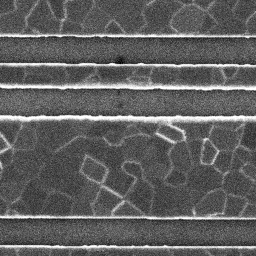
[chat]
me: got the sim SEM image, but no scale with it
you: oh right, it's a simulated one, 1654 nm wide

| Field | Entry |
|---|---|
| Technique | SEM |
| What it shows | lines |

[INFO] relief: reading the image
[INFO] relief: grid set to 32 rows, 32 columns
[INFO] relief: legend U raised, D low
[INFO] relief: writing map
UUUUUUUUUUUUUUUUUUUUUUUUUUUUUUUU
UUUUUUUUUUUUUUUUUUUUUUUUUUUUUUUU
UUUUUUUUUUUUUUUUUUUUUUUUUUUUUUUU
UUUUUUUUUUUUUUUUUUUUUUUUUUUUUUUU
DDUUUDDDDUUUUDUUUUUUUUUUUUUUUUUU
DDDDDDDDDDDDDDDDDDDDDDDDDDDDDDDD
DDDDDDDDDDDDDDDDDDDDDDDDDDDDDDDD
DDDDDDDDDDDDDDDDDDDDDDDDDDDDDDDD
UUUUUUUUUUUUUUUUUUUUUUUUUUUUUUUU
UUUUUUUUUUUUUUUUUUUUUUUUUUUUUUUU
UUUUUUUUUUUUUUUUUUUUUUUUUUUUUUUU
DDDDDDDDDDDDDDDDDDDDDDDDDDDDDDDD
DDDDDDDDDDDDDDDDDDDDDDDDDDDDDDDD
DDDDDDDDDDDDDDDDDDDDDDDDDDDDDDDD
DDDDDDDDDDDDDDDDDDDDDDDDDDDDDDDD
UUUUUUUUUUUUUUUUUUUUUUUUUUUUUUUU
UUUUUUUUUUUUUUUUUUUUUUUUUUUUUUUU
UUUUUUUUUUUUUUUUUUUUUUUUUUUUUUUU
UUUUUUUUUUUUUUUUUUUUUUUUUUUUUUUU
UUUUUUUUUUUUUUUUUUUUUUUUUUUUUUUU
UUUUUUUUUUUUUUUUUUUUUUUUUUUUUUUU
UUUUUUUUUUUUUUUUUUUUUUUUUUUUUUUU
UUUUUUUUUUUUUUUUUUUUUUUUUUUUUUUU
UUUUUUUUUUUUUUUUUUUUUUUUUUUUUUUU
UUUUUUUUUUUUUUUUUUUUUUUUUUUUUUUU
UUUUUUUUUUUUUUUUUUUUUUUUUUUUUUUU
UUUUUUUUUUUUUUUUUUUUUUUUUUUUUUUU
DDDDDDDDDDDDDDDDDDDDDDDDDDDDDDDD
DDDDDDDDDDDDDDDDDDDDDDDDDDDDDDDD
DDDDDDDDDDDDDDDDDDDDDDDDDDDDDDDD
DDDDDDDDDDDDDDDDDDDDDDDDDDDDDDDD
UUUUUUUUUUUUUUUUUUUUUUUUUUUUUUUU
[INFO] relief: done